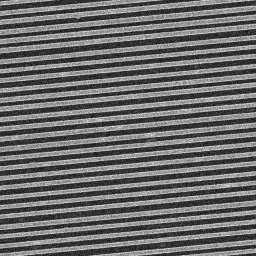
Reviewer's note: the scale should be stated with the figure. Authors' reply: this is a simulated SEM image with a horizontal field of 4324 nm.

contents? parallel lines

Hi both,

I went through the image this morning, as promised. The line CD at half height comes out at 71.4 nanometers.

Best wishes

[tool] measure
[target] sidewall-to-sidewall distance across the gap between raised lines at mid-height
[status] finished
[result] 92.5 nanometres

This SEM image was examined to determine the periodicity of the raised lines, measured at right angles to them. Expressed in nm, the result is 164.